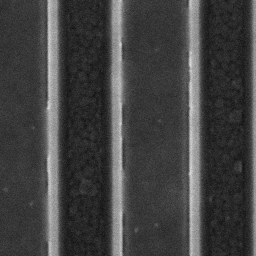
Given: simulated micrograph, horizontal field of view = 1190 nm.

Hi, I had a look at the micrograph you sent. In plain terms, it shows one or a few lines or trenches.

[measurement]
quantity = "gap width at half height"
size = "295 nm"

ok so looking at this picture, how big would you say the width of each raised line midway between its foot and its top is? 362 nanometres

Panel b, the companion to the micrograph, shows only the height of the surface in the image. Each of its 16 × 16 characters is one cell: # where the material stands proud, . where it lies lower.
###....#####....
###....#####....
###....#####....
###....#####....
###....#####....
###....#####....
###....#####....
###....#####....
###....#####....
###....#####....
###....#####....
###....#####....
###....#####....
###....#####....
###....#####....
###....#####....